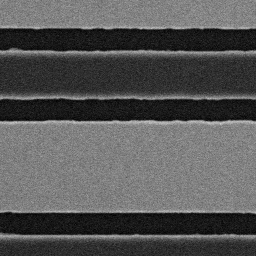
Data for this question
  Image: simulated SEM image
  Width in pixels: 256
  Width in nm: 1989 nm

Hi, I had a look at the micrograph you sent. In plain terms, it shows lines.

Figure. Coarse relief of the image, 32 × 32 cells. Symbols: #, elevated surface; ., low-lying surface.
################################
################################
################################
....#.....##.#...###.###...####.
................................
................................
################################
################################
################################
################################
################################
################################
................................
................................
................................
################################
################################
################################
################################
################################
################################
################################
################################
################################
################################
################################
################################
................................
................................
################################
################################
################################